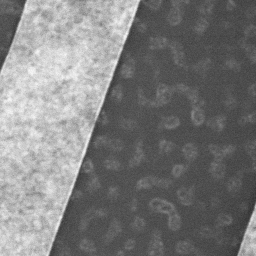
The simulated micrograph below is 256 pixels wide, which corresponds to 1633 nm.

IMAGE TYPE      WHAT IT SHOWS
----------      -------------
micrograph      one or a few lines or trenches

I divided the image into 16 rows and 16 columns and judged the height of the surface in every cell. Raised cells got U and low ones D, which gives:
DDUUUUUUUDDDDDDD
DUUUUUUUDDDDDDDD
DUUUUUUUDDDDDDDD
UUUUUUUDDDDDDDDD
UUUUUUUDDDDDDDDD
UUUUUUUDDDDDDDDD
UUUUUUDDDDDDDDDD
UUUUUUDDDDDDDDDD
UUUUUUDDDDDDDDDD
UUUUUDDDDDDDDDDD
UUUUUDDDDDDDDDDD
UUUUUDDDDDDDDDDD
UUUUDDDDDDDDDDDD
UUUUDDDDDDDDDDDD
UUUUDDDDDDDDDDDU
UUUDDDDDDDDDDDDU